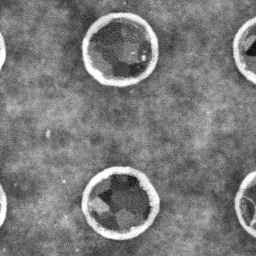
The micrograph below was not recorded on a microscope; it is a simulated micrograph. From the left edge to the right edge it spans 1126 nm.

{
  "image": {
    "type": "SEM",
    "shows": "raised bodies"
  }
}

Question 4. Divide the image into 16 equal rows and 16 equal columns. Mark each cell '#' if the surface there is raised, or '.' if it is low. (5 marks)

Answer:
................
......###.......
.....#####.....#
.....#####.....#
......###......#
................
................
................
................
................
................
......###......#
.....#####.....#
.....#####.....#
......###.......
................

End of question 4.